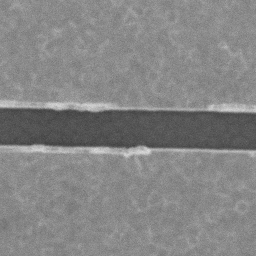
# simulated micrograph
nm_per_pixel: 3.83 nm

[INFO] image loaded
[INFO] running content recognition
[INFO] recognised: one or a few lines or trenches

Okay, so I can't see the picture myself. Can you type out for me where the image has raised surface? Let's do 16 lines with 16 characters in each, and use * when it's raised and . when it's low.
****************
****************
****************
****************
****************
****************
****************
................
................
****************
****************
****************
****************
****************
****************
****************